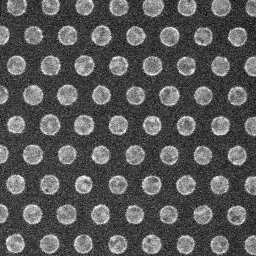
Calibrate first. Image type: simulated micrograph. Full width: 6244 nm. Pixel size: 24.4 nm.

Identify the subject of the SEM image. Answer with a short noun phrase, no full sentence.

a regular array of raised bodies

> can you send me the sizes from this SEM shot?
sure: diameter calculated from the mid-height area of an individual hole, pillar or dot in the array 437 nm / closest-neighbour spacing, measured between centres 0.826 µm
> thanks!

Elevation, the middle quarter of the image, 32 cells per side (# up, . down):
...####.....####....####.....###
...####.....####....####.....###
....##.......##......##.......##
................................
................................
##..............................
###.....###.....###......###....
###....####.....####....####....
###....####.....####....####....
##......##.......##......###....
................................
................................
................................
....##......###......##.......##
...####.....####....####.....###
...####....#####....####....####
...####.....###.....####.....###
.....#........................##
................................
................................
................................
###....####.....####.....###....
###....####.....####....####....
###....####.....####....####....
##......##......###......###....
................................
................................
................................
....##......###......##......###
...####....#####....####....####
...####....#####....####....####
...###......###.....####.....###